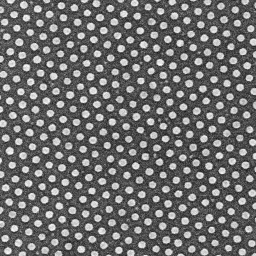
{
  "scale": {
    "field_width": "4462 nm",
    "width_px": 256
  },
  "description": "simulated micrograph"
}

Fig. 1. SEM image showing a regular array of raised bodies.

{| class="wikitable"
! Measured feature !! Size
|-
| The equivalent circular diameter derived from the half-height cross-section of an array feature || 113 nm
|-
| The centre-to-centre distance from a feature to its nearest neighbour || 226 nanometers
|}